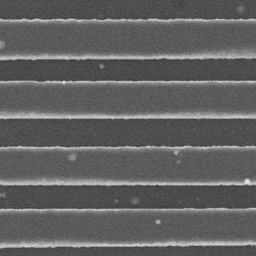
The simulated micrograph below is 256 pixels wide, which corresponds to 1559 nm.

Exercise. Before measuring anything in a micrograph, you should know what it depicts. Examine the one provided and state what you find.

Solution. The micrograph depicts lines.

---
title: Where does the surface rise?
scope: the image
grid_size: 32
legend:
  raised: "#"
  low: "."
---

................................
................................
..###.####.#.#.#####..####.#.###
################################
################################
################################
################################
................................
................................
................................
################################
################################
################################
################################
################################
................................
................................
................................
########.#######################
################################
################################
################################
################################
................................
................................
................................
################################
################################
################################
################################
################################
................................